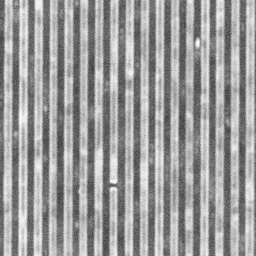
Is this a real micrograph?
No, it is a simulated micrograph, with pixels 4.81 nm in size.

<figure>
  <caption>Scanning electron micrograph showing parallel lines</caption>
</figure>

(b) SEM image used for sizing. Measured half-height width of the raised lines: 6.51 px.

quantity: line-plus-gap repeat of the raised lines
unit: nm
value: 72.8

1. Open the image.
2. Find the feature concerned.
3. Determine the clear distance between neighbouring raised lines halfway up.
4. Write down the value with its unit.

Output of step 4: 40.3 nm